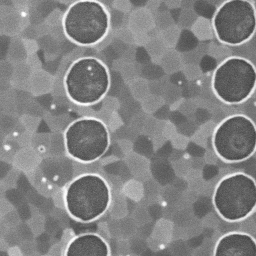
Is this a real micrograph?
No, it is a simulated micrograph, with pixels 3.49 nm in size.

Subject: holes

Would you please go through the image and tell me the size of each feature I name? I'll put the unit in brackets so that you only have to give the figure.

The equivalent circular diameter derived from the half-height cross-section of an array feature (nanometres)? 155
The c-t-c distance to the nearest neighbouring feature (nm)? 204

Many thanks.